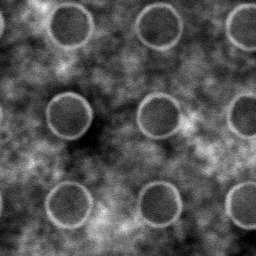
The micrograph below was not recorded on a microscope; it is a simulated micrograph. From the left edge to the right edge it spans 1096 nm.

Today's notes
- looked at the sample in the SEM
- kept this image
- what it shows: raised bodies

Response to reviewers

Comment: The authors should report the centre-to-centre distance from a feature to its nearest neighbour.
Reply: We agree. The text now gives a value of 383 nm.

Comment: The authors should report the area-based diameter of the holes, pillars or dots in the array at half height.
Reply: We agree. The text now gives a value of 192 nm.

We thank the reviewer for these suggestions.